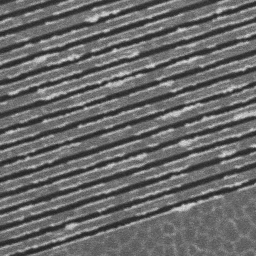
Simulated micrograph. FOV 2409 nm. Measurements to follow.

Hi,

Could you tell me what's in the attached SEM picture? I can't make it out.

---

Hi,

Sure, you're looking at parallel lines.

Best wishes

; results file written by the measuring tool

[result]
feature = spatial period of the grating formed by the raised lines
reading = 145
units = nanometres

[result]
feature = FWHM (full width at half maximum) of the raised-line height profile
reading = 9.66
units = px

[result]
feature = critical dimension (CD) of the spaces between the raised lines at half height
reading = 5.73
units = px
